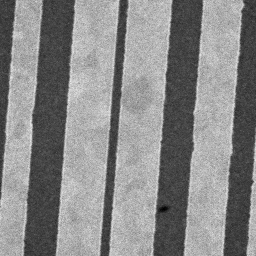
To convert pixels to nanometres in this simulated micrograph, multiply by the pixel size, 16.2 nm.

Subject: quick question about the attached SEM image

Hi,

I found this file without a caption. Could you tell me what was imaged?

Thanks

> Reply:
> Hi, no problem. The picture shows one or a few lines or trenches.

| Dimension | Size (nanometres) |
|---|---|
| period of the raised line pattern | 1040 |